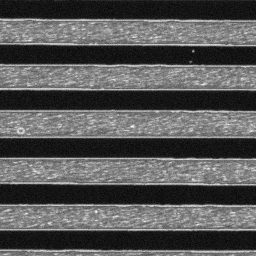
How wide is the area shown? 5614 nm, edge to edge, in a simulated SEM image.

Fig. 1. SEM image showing lines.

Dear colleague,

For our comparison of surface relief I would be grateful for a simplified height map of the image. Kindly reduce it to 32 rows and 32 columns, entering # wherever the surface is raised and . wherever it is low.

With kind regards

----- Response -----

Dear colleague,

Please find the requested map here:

################################
################################
..................##############
................................
................................
................................
################################
################################
................................
................................
................................
################################
################################
################################
................................
................................
................................
################################
################################
################################
................................
................................
................................
################################
################################
################################
................................
................................
................................
################################
################################
................................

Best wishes